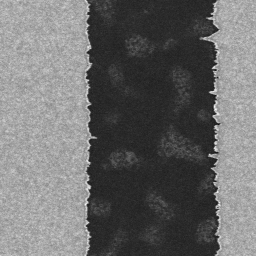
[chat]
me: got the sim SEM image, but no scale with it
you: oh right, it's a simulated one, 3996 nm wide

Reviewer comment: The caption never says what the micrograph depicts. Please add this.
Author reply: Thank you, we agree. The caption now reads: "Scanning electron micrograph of one or a few lines or trenches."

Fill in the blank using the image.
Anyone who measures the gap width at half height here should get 1.99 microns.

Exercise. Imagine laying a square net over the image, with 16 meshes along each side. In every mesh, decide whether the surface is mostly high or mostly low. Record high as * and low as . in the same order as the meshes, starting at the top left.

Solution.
*****........***
*****........***
******.......***
******........**
*****........***
*****........***
*****........***
******........**
******........**
******.......***
*****........***
******........**
*****.........**
*****.........**
*****.........**
*****.........**